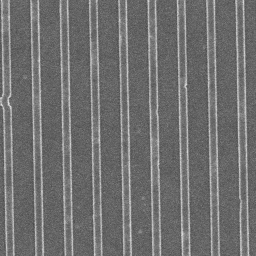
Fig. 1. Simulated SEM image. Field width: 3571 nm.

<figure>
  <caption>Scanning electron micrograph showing parallel lines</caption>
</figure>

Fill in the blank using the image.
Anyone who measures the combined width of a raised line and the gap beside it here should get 409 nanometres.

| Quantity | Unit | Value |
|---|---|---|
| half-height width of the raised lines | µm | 0.108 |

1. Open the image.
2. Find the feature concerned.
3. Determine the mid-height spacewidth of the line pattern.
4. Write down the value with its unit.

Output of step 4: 298 nanometers